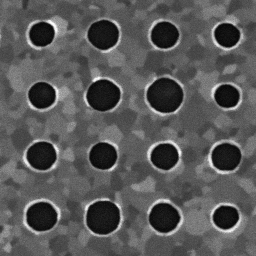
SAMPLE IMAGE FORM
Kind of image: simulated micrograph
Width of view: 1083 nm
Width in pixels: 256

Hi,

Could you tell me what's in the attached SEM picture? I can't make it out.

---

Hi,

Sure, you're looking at a regular array of holes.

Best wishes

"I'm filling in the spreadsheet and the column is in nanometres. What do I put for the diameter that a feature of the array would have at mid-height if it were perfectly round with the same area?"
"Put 123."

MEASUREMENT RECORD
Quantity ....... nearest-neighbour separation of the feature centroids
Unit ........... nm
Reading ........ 256